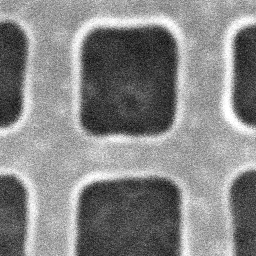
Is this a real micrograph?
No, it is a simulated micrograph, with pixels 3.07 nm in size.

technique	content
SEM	holes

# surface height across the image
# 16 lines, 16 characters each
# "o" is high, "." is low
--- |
oooooooooooooooo
.ooooo.o..ooooo.
..ooo......ooo..
..ooo......ooo..
..ooo......ooo..
..ooo......ooo..
.oooo......ooo..
.oooo......oooo.
oooooo....oooooo
oooooooooooooooo
ooooooooooooooo.
..ooo......ooo..
..ooo......ooo..
..ooo......ooo..
..ooo......ooo..
..ooo......ooo..